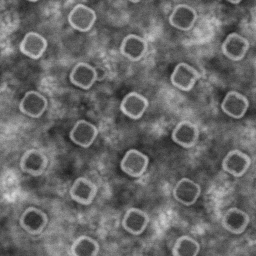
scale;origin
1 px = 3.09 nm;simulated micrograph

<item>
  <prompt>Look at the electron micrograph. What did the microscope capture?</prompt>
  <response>a regular array of raised bodies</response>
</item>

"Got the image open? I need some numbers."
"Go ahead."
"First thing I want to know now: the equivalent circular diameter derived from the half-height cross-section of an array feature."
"0.0748 micrometres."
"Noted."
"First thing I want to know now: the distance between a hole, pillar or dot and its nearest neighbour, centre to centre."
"0.178 micrometres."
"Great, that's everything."